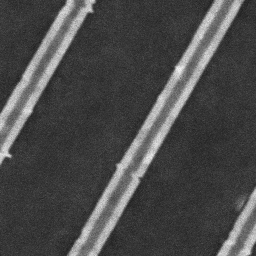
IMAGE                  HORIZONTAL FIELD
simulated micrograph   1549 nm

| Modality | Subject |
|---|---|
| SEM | one or a few lines or trenches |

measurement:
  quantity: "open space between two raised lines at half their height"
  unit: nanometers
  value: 670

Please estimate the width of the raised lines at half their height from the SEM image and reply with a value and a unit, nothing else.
111 nm